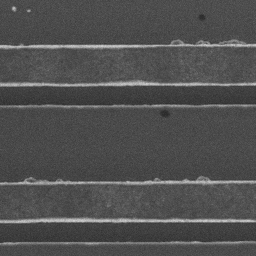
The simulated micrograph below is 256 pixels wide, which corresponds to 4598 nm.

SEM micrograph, lines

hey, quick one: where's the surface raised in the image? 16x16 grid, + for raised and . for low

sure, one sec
................
................
................
++++++++++++++++
++++++++++++++++
................
................
................
................
................
................
++++++++++++++++
++++++++++++++++
++++++++++++++++
................
................